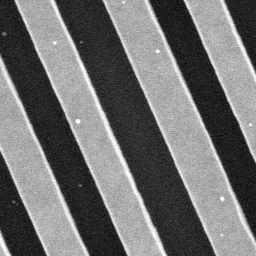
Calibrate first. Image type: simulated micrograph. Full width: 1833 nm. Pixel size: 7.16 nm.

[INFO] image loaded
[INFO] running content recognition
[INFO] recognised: lines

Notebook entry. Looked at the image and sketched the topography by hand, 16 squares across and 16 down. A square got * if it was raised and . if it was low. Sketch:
.***...**...**..
..**...***..***.
..***...**...**.
..***...***..***
...**...***..***
*..***...***..**
*...**...***..**
**..***...***..*
**...**...***..*
***..***...***..
.**...**...***..
.***..**....**..
.***..***...***.
..**...**...***.
..***..***...***
...**...**...***